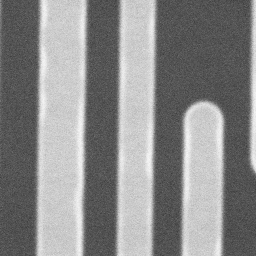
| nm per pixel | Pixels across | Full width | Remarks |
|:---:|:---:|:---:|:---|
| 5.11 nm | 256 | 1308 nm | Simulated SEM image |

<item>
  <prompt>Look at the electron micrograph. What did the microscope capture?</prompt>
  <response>groups of lines, slits or small figures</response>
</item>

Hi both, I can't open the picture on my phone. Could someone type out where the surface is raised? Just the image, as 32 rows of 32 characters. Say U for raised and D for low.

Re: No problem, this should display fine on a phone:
DDDDDUUUUUUDDDDUUUUDDDDDDDDDDDDD
DDDDDUUUUUUDDDDUUUUDDDDDDDDDDDDD
DDDDDUUUUUUDDDDUUUUDDDDDDDDDDDDD
DDDDDUUUUUDDDDDUUUUDDDDDDDDDDDDD
DDDDDUUUUUDDDDDUUUUDDDDDDDDDDDDD
DDDDDUUUUUUDDDDUUUUDDDDDDDDDDDDD
DDDDDUUUUUUDDDDUUUUDDDDDDDDDDDDD
DDDDDUUUUUUDDDDUUUUDDDDDDDDDDDDD
DDDDDUUUUUDDDDDUUUUDDDDDDDDDDDDD
DDDDDUUUUUUDDDDUUUUDDDDDDDDDDDDD
DDDDDUUUUUUDDDDUUUUDDDDDDDDDDDDD
DDDDDUUUUUUDDDDUUUUDDDDDDDDDDDDD
DDDDDUUUUUDDDDDUUUUDDDDDDDDDDDDD
DDDDDUUUUUDDDDDUUUUDDDDDUUUDDDDD
DDDDDUUUUUDDDDDUUUUDDDDUUUUUDDDD
DDDDDUUUUUDDDDDUUUUDDDDUUUUUDDDD
DDDDDUUUUUDDDDDUUUUDDDDUUUUUDDDD
DDDDDUUUUUDDDDDUUUUDDDDUUUUUDDDD
DDDDDUUUUUDDDDDUUUUDDDDUUUUUDDDD
DDDDDUUUUUDDDDDUUUUDDDDUUUUUDDDD
DDDDDUUUUUDDDDDUUUUDDDDUUUUUDDDD
DDDDDUUUUUDDDDDUUUUDDDDUUUUUDDDD
DDDDDUUUUUDDDDDUUUUDDDDUUUUUDDDD
DDDDDUUUUUDDDDDUUUUDDDDUUUUUDDDD
DDDDDUUUUUDDDDDUUUUDDDDUUUUUDDDD
DDDDDUUUUUDDDDDUUUUDDDDUUUUUDDDD
DDDDDUUUUUDDDDDUUUUDDDDUUUUUDDDD
DDDDDUUUUUDDDDDUUUUDDDDUUUUUDDDD
DDDDDUUUUUDDDDDUUUUDDDDUUUUUDDDD
DDDDDUUUUUDDDDDUUUUDDDDUUUUUDDDD
DDDDDUUUUUDDDDDUUUUDDDDUUUUUDDDD
DDDDDUUUUUDDDDDUUUUDDDDUUUUDDDDD